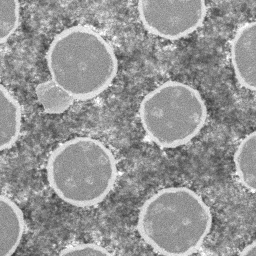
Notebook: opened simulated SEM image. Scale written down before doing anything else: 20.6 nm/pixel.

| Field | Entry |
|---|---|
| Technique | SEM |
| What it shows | raised bodies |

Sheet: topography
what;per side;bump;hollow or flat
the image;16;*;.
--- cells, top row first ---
*........****...
*........***....
....**.........*
...****........*
...****........*
...***....**....
*..*.....****...
*........****...
*........***....
....***........*
...****........*
...****........*
....**...***....
*........****...
*........****...
*....*....**....